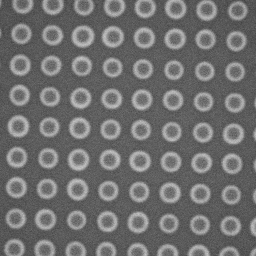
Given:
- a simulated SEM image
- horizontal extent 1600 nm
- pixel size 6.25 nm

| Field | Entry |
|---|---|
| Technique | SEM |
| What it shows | an array of small figures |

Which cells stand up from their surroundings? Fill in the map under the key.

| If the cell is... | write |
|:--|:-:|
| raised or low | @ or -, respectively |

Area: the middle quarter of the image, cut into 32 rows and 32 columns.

--@@@@@---@@@@---@@@@@---@@@@@--
--@@@@@---@@@@---@@@@@---@@@@@--
---@@@----@@@@----@@@@---@@@@@--
-------------------@@-----@@@---
--------------------------------
--------------------------------
---@@@-----@@------@------------
--@@@@----@@@@---@@@@@---@@@@---
--@@@@@--@@@@@---@@@@@---@@@@@--
--@@@@----@@@@---@@@@@---@@@@@--
--@@@@----@@@@----@@@----@@@@---
--------------------------------
--------------------------------
---@----------------------------
--@@@@----@@@-----@@@-----------
-@@@@@---@@@@@---@@@@----@@@@---
-@@@@@---@@@@@---@@@@@---@@@@---
--@@@@---@@@@@---@@@@----@@@@---
---@@-----@@@-----@@@----@@@@---
--------------------------------
--------------------------------
---@@---------------------------
-@@@@@---@@@@@---@@@@----@@@----
-@@@@@---@@@@@--@@@@@---@@@@@---
-@@@@@---@@@@@--@@@@@@--@@@@@---
-@@@@@---@@@@----@@@@----@@@@---
---@--------------@@@----@@@----
--------------------------------
--------------------------------
-@@@@-----@@--------------------
-@@@@@---@@@@----@@@@----@@@----
-@@@@@---@@@@---@@@@@---@@@@@---